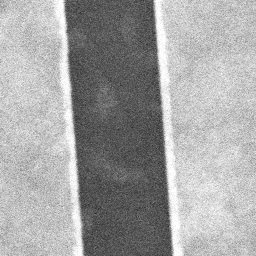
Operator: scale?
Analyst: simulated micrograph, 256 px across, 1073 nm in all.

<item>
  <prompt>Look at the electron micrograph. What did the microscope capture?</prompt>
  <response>one or a few lines or trenches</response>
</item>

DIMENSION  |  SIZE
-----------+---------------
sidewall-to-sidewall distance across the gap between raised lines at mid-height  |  402 nanometres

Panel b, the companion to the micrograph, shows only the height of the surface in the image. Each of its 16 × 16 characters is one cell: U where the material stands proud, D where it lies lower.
UUUUDDDDDDUUUUUU
UUUUDDDDDDUUUUUU
UUUUDDDDDDUUUUUU
UUUUDDDDDDUUUUUU
UUUUDDDDDDUUUUUU
UUUUDDDDDDUUUUUU
UUUUDDDDDDUUUUUU
UUUUDDDDDDUUUUUU
UUUUDDDDDDUUUUUU
UUUUUDDDDDDUUUUU
UUUUUDDDDDDUUUUU
UUUUUDDDDDDUUUUU
UUUUUDDDDDDUUUUU
UUUUUDDDDDDUUUUU
UUUUUDDDDDDUUUUU
UUUUUDDDDDDUUUUU